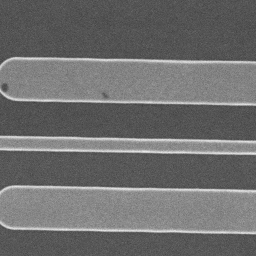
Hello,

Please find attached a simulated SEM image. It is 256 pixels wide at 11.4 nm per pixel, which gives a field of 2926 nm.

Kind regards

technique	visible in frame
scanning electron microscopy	groups of lines, slits or small figures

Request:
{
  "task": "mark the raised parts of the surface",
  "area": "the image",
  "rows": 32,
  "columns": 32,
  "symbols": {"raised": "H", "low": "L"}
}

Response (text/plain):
LLLLLLLLLLLLLLLLLLLLLLLLLLLLLLLL
LLLLLLLLLLLLLLLLLLLLLLLLLLLLLLLL
LLLLLLLLLLLLLLLLLLLLLLLLLLLLLLLL
LLLLLLLLLLLLLLLLLLLLLLLLLLLLLLLL
LLLLLLLLLLLLLLLLLLLLLLLLLLLLLLLL
LLLLLLLLLLLLLLLLLLLLLLLLLLLLLLLL
LLLLLLLLLLLLLLLLLLLLLLLLLLLLLLLL
LHHHHHHHHHHHHHHHHHLLLLLLLLLLLLLL
HHHHHHHHHHHHHHHHHHHHHHHHHHHHHHHH
HHHHHHHHHHHHHHHHHHHHHHHHHHHHHHHH
HHHHHHHHHHHHHHHHHHHHHHHHHHHHHHHH
HHHHHHHHHHHHHHHHHHHHHHHHHHHHHHHH
LLLLHHHHHHHHHHHHHHHHHHHHHHHHHHHH
LLLLLLLLLLLLLLLLLLLLLLLLLLLLLLLL
LLLLLLLLLLLLLLLLLLLLLLLLLLLLLLLL
LLLLLLLLLLLLLLLLLLLLLLLLLLLLLLLL
LLLLLLLLLLLLLLLLLLLLLLLLLLLLLLLL
HHHHHHHHHHHHHHHHHHHHHHHLLLLLLLLL
HHHHHHHHHHHHHHHHHHHHHHHHHHHHHHHH
LLLLLLLLLLLLLLLLLLLLLLLLLLLLLLLL
LLLLLLLLLLLLLLLLLLLLLLLLLLLLLLLL
LLLLLLLLLLLLLLLLLLLLLLLLLLLLLLLL
LLLLLLLLLLLLLLLLLLLLLLLLLLLLLLLL
LHHHHHHHHHHHHLLLLLLLLLLLLLLLLLLL
HHHHHHHHHHHHHHHHHHHHHHHHHHHHHHHH
HHHHHHHHHHHHHHHHHHHHHHHHHHHHHHHH
HHHHHHHHHHHHHHHHHHHHHHHHHHHHHHHH
HHHHHHHHHHHHHHHHHHHHHHHHHHHHHHHH
LHHHHHHHHHHHHHHHHHHHHHHHHHHHHHHH
LLLLLLLLLLLLLLLLLLLLLLLLLLLLLLLL
LLLLLLLLLLLLLLLLLLLLLLLLLLLLLLLL
LLLLLLLLLLLLLLLLLLLLLLLLLLLLLLLL